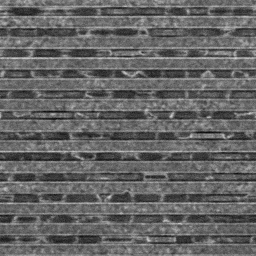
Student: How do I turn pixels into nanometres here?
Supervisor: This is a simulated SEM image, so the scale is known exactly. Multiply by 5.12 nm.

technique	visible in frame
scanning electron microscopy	parallel lines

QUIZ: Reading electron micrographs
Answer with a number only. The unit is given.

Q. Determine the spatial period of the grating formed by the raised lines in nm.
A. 106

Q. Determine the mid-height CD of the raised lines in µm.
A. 0.055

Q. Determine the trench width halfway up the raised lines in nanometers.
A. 50.5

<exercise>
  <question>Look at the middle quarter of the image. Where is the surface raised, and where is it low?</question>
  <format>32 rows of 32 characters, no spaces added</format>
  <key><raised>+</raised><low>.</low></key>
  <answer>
++++++++++++++++++++++++++++++++
................................
................................
................................
++++++++++++++++++++++++++++++++
++++++++++++++++++++++++++++++++
................................
................................
................................
++++++++++++++++++++++++++++++++
++++++++++++++++++++++++++++++++
++++++++++++++++++++++++++++++++
................................
................................
++++++++++++++++++++++++++++++++
++++++++++++++++++++++++++++++++
++++++++++++++++++++++++++++++++
................................
................................
++++++++++++++++++++++++++++++++
++++++++++++++++++++++++++++++++
++++++++++++++++++++++++++++++++
................................
................................
................................
++++++++++++++++++++++++++++++++
++++++++++++++++++++++++++++++++
................................
................................
................................
++++++++++++++++++++++++++++++++
++++++++++++++++++++++++++++++++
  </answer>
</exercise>